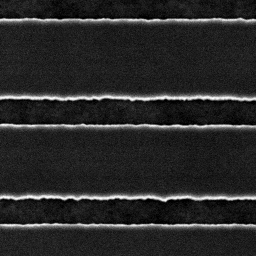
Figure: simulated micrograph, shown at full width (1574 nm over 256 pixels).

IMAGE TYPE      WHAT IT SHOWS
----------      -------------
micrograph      lines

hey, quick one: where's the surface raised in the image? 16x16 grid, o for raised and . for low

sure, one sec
................
oooooooooooooooo
oooooooooooooooo
oooooooooooooooo
oooooooooooooooo
oooooooooooooooo
................
................
oooooooooooooooo
oooooooooooooooo
oooooooooooooooo
oooooooooooooooo
..........o.....
................
oooooooooooooooo
oooooooooooooooo